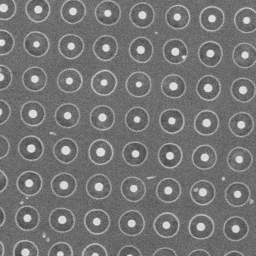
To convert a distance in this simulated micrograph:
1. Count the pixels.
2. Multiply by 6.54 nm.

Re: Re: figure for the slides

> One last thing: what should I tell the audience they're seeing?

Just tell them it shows an array of small figures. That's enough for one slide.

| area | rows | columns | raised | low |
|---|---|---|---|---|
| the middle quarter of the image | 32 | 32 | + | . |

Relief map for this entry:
++++++++++++++++++++++++++++++++
+..+++++++++++++++++++++++++++++
....++++....+++++...++++++++++++
....+++......+++.....++++....+++
.+..+++..++..+++......+++.....++
....+++......+++..+...++...+..++
...+++++....++++.....++++.....++
+++++++++..++++++....++++.....++
++++++++++++++++++++++++++++++++
++++++++++++++++++++++++++++++++
...++++++.++++++++++++++++++++++
...++++.....+++++...++++++..++++
+...+++.....++++.....++++....+++
+...+++..+...++...+..+++......++
...++++.....+++......+++..++..++
..++++++....++++.....+++......++
+++++++++++++++++..++++++....+++
++++++++++++++++++++++++++++++++
++++++++++++++++++++++++++++++++
..++++++...+++++++++++++++++++++
...++++.....++++....+++++...++++
+..+++..++..+++......+++.....+++
+..+++..++..+++..++..+++..+..+++
...++++.....+++.....++++..+..+++
.++++++....+++++....++++.....+++
+++++++++++++++++++++++++...++++
++++++++++++++++++++++++++++++++
.+++++++++++++++++++++++++++++++
..+++++....+++++..++++++++++++++
...+++.....++++.....++++....++++
+..+++..++..++...+..++++.....+++
...+++..+...++...+..+++..++..+++